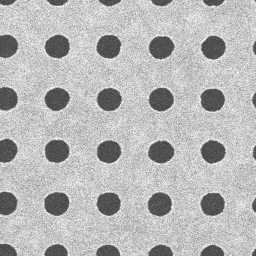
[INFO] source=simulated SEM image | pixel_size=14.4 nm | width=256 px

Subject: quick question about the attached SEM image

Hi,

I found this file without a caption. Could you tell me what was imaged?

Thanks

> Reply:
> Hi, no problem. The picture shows a regular array of holes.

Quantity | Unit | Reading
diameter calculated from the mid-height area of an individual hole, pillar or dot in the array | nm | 355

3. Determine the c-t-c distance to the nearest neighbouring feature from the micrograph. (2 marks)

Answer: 744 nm